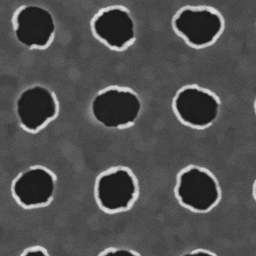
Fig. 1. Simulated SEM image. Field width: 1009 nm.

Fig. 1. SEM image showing a regular array of holes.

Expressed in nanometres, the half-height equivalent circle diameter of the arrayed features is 148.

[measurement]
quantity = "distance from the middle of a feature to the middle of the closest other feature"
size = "0.316 microns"